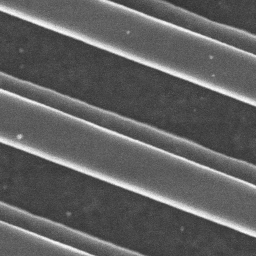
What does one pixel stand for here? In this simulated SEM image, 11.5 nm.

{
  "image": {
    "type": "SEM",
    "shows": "lines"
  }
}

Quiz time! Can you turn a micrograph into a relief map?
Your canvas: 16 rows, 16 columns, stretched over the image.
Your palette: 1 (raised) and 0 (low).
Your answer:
1111111111100000
0011111111111000
0000011111111111
0000000011111111
0000000000111111
1110000000000111
1111100000000000
1111111100000000
1111111111100000
0011111111111000
0000111111111111
0000000111111111
0000000000111111
1000000000001111
1111100000000001
1111111000000000